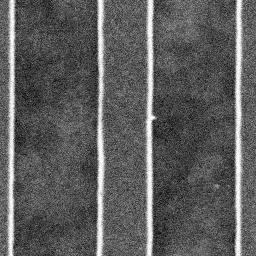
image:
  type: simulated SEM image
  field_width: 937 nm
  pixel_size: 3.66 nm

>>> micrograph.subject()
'one or a few lines or trenches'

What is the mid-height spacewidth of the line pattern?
318 nm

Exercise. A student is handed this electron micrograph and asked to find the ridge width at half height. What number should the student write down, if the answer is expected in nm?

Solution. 186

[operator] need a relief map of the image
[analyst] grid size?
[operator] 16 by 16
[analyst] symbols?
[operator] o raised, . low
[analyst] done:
o.....ooo......o
o.....ooo......o
o.....ooo......o
o.....ooo......o
o.....ooo......o
o.....ooo......o
o.....ooo......o
o.....ooo......o
o.....ooo......o
o.....ooo......o
o.....ooo......o
o.....ooo......o
o.....ooo......o
o.....ooo......o
o.....ooo......o
o.....ooo......o